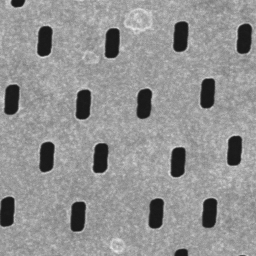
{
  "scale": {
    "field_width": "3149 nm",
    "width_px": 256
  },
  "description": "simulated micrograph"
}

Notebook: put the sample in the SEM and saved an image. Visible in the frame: a regular array of holes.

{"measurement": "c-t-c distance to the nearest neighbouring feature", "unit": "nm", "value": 746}